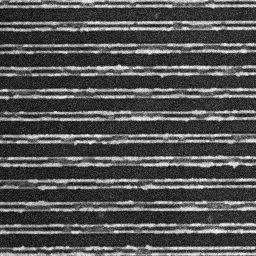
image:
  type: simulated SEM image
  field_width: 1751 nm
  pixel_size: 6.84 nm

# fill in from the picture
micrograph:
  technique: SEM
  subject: parallel lines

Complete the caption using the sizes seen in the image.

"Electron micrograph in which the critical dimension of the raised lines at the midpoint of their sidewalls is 8.74 pixels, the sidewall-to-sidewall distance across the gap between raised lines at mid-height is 0.0931 micrometres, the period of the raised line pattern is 154 nanometers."